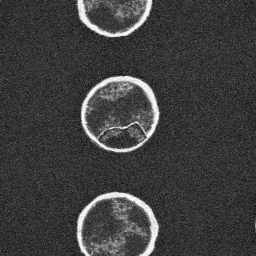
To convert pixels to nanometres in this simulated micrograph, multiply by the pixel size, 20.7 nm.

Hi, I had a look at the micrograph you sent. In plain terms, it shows raised bodies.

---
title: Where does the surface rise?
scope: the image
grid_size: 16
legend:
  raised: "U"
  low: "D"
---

DDDDDUUUUDDDDDDD
DDDDDDUUUDDDDDDD
DDDDDDDDDDDDDDDD
DDDDDDDDDDDDDDDD
DDDDDDDDDDDDDDDD
DDDDDDUUUDDDDDDD
DDDDDUUUUUDDDDDD
DDDDDUUUUUDDDDDD
DDDDDDUUUDDDDDDD
DDDDDDDDDDDDDDDD
DDDDDDDDDDDDDDDD
DDDDDDDDDDDDDDDD
DDDDDDUUDDDDDDDD
DDDDDUUUUDDDDDDD
DDDDDUUUUUDDDDDD
DDDDDUUUUDDDDDDD